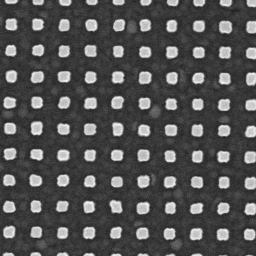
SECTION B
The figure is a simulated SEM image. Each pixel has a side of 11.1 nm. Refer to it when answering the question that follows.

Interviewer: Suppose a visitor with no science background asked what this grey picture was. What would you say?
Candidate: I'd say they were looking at a regular array of raised bodies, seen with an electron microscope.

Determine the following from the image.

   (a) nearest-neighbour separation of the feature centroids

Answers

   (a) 287 nm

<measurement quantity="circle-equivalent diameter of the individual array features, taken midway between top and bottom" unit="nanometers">127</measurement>